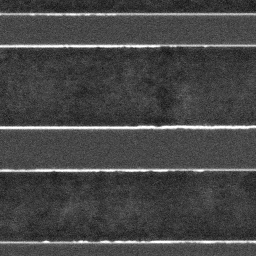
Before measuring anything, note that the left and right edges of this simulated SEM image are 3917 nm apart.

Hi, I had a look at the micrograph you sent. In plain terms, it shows lines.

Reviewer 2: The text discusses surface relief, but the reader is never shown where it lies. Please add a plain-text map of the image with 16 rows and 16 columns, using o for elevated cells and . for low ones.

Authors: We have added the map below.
................
oooooooooooooooo
oooooooooooooooo
................
................
................
................
................
oooooooooooooooo
oooooooooooooooo
oooooooooooooooo
................
................
................
................
oooooooooooooooo